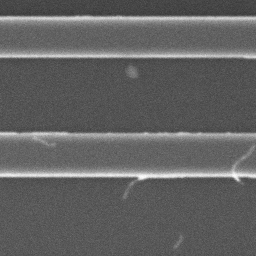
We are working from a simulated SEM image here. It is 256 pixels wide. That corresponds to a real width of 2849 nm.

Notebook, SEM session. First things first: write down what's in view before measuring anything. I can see lines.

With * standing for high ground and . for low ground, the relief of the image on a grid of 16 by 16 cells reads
................
****************
****************
****************
................
................
................
................
****************
****************
****************
................
................
................
................
................